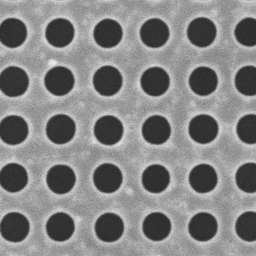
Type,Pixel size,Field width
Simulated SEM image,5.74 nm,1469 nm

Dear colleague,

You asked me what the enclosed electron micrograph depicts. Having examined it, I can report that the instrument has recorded a regular array of holes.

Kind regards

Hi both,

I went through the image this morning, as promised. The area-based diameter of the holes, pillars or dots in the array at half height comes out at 171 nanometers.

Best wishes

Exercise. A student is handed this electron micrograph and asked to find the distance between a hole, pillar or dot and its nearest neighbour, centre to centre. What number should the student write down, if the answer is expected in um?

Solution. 0.272